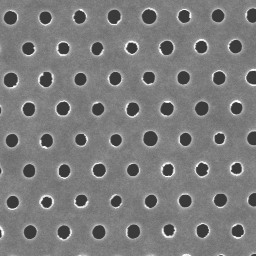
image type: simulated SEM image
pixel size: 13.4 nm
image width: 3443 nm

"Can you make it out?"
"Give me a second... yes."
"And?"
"a regular array of holes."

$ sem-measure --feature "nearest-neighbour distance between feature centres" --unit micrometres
0.459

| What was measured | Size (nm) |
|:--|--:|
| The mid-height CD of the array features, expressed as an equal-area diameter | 170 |